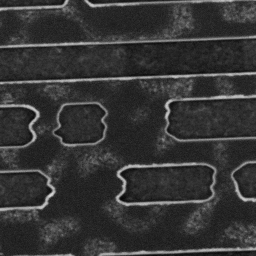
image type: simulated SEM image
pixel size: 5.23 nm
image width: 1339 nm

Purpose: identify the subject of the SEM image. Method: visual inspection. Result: one or a few lines or trenches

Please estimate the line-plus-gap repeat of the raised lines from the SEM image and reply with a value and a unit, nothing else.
357 nanometers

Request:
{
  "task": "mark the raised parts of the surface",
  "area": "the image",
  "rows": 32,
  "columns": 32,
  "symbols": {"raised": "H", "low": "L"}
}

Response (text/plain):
LLLLLLLLHHHHLLLHHHHHHHHHHHHHHHHH
HHHHHHHHHHHHHHHHHHHHHHHHHHHHHHHH
HHHHHHHHHHHHHHHHHHHHHHHHHHHHHHHH
HHHHHHHHHHHHHHHHHHHHHHHHHHHHHHHH
HHHHHHHHHHHHHHHHHHHHHHHHHHHHHHHH
HHHHHHHHHHHLLLLLLLLLLLLLLLLLLLLL
LLLLLLLLLLLLLLLLLLLLLLLLLLLLLLLL
LLLLLLLLLLLLLLLLLLLLLLLLLLLLLLLL
LLLLLLLLLLLLLLLLLLLLLLLLLLLLLLLL
LLLLLLLLLLLLLLLLLLLLLHHHHHHHHHHH
HHHHHHHHHHHHHHHHHHHHHHHHHHHHHHHH
HHHHHHHHHHHHHHHHHHHHHHHHHHHHHHHH
HHHHHHHHHHHHHHHHHHHHHHHLLLLLLLLL
LLLLHHHHLLLLLHHHHHHHHLLLLLLLLLLL
LLLLHHHLLLLLLHHHHHHHHLLLLLLLLLLL
LLLLHHHLLLLLLHHHHHHHHLLLLLLLLLLL
LLLLHHHLLLLLLHHHHHHHHLLLLLLLLLLL
LLLLHHHHLLLLHHHHHHHHHHLLLLHHHHHH
HHHHHHHHHHHHHHHHHHHHHHHHHHHHHHHH
HHHHHHHHHHHHHHHHHHHHHHHHHHHHHHHH
HHHHHHHHHHHHHHHHHHHHHHHHHHHHHHHL
LLLLLHHHHHHHHHHLLLLLLLLLLLLHHLLL
LLLLLLHHHHHHHHHLLLLLLLLLLLLHHLLL
LLLLLLHHHHHHHHHHLLLLLLLLLLHHHHLL
LLLLLLHHHHHHHHHLLLLLLLLLLLHHHHLL
LLLLLHHHHHHHHHHHHHHHHHHHHHHHHHHH
HHHHHHHHHHHHHHHHHHHHHHHHHHHHHHHH
HHHHHHHHHHHHHHHHHHHHHHHHHHHHHHHH
HHHHHHHHHHHHHHHHHHHHHHHHHHHHHHHH
HHHHHHHHHHHHHHHHHHHHHHHHHHHHHHHH
HHHHHHHHHHHHHHHHHHHHHHHHHHHHHHHH
HHHHHHHHHHHHHHHHHHHHHHHLLLLLLLLL